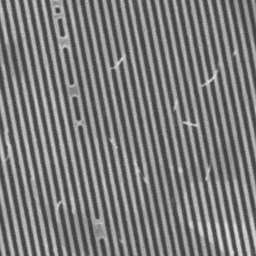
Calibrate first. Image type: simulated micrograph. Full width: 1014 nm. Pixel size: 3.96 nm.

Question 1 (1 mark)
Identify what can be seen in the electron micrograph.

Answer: parallel lines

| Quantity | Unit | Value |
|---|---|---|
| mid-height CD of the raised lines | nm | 10.2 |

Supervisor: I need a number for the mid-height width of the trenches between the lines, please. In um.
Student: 0.0233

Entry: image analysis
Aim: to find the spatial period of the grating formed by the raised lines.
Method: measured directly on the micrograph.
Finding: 8.61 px